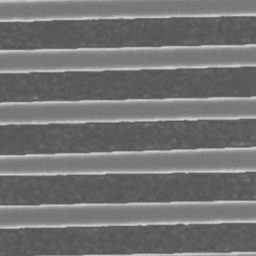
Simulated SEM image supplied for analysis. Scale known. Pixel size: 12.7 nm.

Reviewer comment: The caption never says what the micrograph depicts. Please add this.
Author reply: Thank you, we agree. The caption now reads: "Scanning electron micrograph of lines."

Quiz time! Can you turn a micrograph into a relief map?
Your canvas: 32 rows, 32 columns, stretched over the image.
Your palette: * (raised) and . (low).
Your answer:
********************************
********************************
*******.........................
................................
................................
................................
********************************
********************************
**********************..........
................................
................................
................................
...............*****************
********************************
********************************
*...............................
................................
................................
...............................*
********************************
********************************
**********************..........
................................
................................
................................
................****************
********************************
********************************
................................
................................
................................
................................